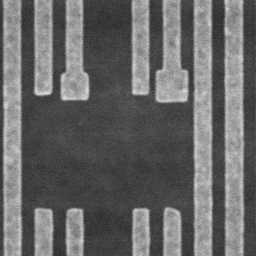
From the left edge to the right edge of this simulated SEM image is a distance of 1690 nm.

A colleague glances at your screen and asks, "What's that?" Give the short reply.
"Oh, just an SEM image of wiring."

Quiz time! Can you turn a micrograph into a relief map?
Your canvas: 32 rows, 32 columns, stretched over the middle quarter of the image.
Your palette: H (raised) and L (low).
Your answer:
LHHHLLLLLLLLLLLLLHHHHLLLLHHHHLLL
LHHHLLLLLLLLLLLLLHHHHLLLLHHHHLLL
HHHHHLLLLLLLLLLLLHHHHLLHHHHHHHHL
HHHHHHLLLLLLLLLLLHHHHLLHHHHHHHHL
HHHHHHLLLLLLLLLLLHHHHLLHHHHHHHHL
HHHHHHLLLLLLLLLLLHHHHLLHHHHHHHHL
HHHHHHLLLLLLLLLLLHHHHLLHHHHHHHHL
HHHHHHLLLLLLLLLLLLLLLLLHHHHHHHHL
HHHHHHLLLLLLLLLLLLLLLLLHHHHHHHHL
LLLLLLLLLLLLLLLLLLLLLLLLLLLLLLLL
LLLLLLLLLLLLLLLLLLLLLLLLLLLLLLLL
LLLLLLLLLLLLLLLLLLLLLLLLLLLLLLLL
LLLLLLLLLLLLLLLLLLLLLLLLLLLLLLLL
LLLLLLLLLLLLLLLLLLLLLLLLLLLLLLLL
LLLLLLLLLLLLLLLLLLLLLLLLLLLLLLLL
LLLLLLLLLLLLLLLLLLLLLLLLLLLLLLLL
LLLLLLLLLLLLLLLLLLLLLLLLLLLLLLLL
LLLLLLLLLLLLLLLLLLLLLLLLLLLLLLLL
LLLLLLLLLLLLLLLLLLLLLLLLLLLLLLLL
LLLLLLLLLLLLLLLLLLLLLLLLLLLLLLLL
LLLLLLLLLLLLLLLLLLLLLLLLLLLLLLLL
LLLLLLLLLLLLLLLLLLLLLLLLLLLLLLLL
LLLLLLLLLLLLLLLLLLLLLLLLLLLLLLLL
LLLLLLLLLLLLLLLLLLLLLLLLLLLLLLLL
LLLLLLLLLLLLLLLLLLLLLLLLLLLLLLLL
LLLLLLLLLLLLLLLLLLLLLLLLLLLLLLLL
LLLLLLLLLLLLLLLLLLLLLLLLLLLLLLLL
LLLLLLLLLLLLLLLLLLLLLLLLLLLLLLLL
LLLLLLLLLLLLLLLLLLLLLLLLLLLLLLLL
LLLLLLLLLLLLLLLLLLLLLLLLLLLLLLLL
LLLLLLLLLLLLLLLLLLLLLLLLLLLLLLLL
LLLLLLLLLLLLLLLLLLLLLLLLLLLLLLLL